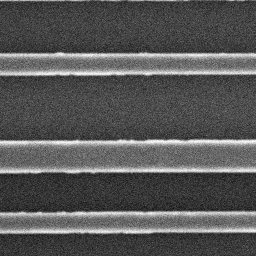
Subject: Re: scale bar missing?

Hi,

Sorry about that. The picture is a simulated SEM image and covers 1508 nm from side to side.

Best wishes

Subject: lines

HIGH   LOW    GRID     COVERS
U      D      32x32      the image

DDDDDDDDDDDDDDDDDDDDDDDDDDDDDDDD
DDDDDDDDDDDDDDDDDDDDDDDDDDDDDDDD
DDDDDDDDDDDDDDDDDDDDDDDDDDDDDDDD
DDDDDDDDDDDDDDDDDDDDDDDDDDDDDDDD
DDDDDDDDDDDDDDDDDDDDDDDDDDDDDDDD
DDDDDDDDDDDDDDDDDDDDDDDDDDDDDDDD
DDDDDDDDDDDDDDDDDDDDDDDDDDDDDDDD
UUUUUUUUUUUUUUUUUUUUUUUUUUUUUUUU
UUUUUUUUUUUUUUUUUUUUUUUUUUUUUUUU
DDDDDDDDDDDDDDDDDDDDDDDDDDDDDDDD
DDDDDDDDDDDDDDDDDDDDDDDDDDDDDDDD
DDDDDDDDDDDDDDDDDDDDDDDDDDDDDDDD
DDDDDDDDDDDDDDDDDDDDDDDDDDDDDDDD
DDDDDDDDDDDDDDDDDDDDDDDDDDDDDDDD
DDDDDDDDDDDDDDDDDDDDDDDDDDDDDDDD
DDDDDDDDDDDDDDDDDDDDDDDDDDDDDDDD
DDDDDDDDDDDDDDDDDDDDDDDDDDDDDDDD
DDDDDDDDDDDDDDDDDDDDDDDDDDDDDDDD
UUUUUUUUUUUUUUUUUUUUUUUUUUUUUUUU
UUUUUUUUUUUUUUUUUUUUUUUUUUUUUUUU
UUUUUUUUUUUUUUUUUUUUUUUUUUUUUUUU
UUUDUDDDUUDDDDDDDDDDDDDDDDDDDDDD
DDDDDDDDDDDDDDDDDDDDDDDDDDDDDDDD
DDDDDDDDDDDDDDDDDDDDDDDDDDDDDDDD
DDDDDDDDDDDDDDDDDDDDDDDDDDDDDDDD
DDDDDDDDDDDDDDDDDDDDDDDDDDDDDDDD
DDDDDDDDDDDDDDDDDDDDDDDDDDDDDDDD
UUUUUUUUUUUUUUUUUUUUUUUUUUUUUUUU
UUUUUUUUUUUUUUUUUUUUUUUUUUUUUUUU
DDDDDDDDDDDDDDDDDDDDDDDDDDDDDDDD
DDDDDDDDDDDDDDDDDDDDDDDDDDDDDDDD
DDDDDDDDDDDDDDDDDDDDDDDDDDDDDDDD